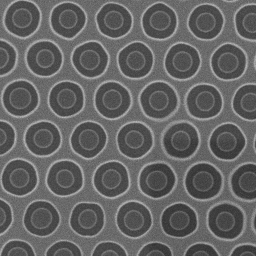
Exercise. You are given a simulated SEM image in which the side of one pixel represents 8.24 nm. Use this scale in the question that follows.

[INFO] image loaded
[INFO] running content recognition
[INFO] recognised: an array of small figures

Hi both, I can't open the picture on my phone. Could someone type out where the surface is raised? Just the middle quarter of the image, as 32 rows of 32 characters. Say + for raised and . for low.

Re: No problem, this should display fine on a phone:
+++..+++...+++..++++..+++...++++
+++.......++++........+++...+++.
++++.....++++++......+++++......
++++++.++++++++++..+++++++++....
..+++++++++..++++++++++..+++++++
....+++++......++++++......+++++
++...+++........++++........++++
+++..+++..++++...++...+++...+++.
+++..+++..++++...++..+++++..++..
+++..+++..++++...++..+++++...+..
++...+++..++++..+++...++++..+++.
....++++........++++........+++.
...++++++......+++++.......++++.
+++++++++++..+++++++++....++++++
+++++..+++++++++++.++++++++++..+
+++......++++++......+++++......
++........++++.......++++.......
++..++++...+++..+++...+++...+++.
++..++++...++..+++++..++...++++.
+...++++...++...++++..++...++++.
++..++++..++++..+++...+++..++++.
++........++++.......++++....+..
++++.....++++++.....++++++......
+++++..++++++++++.++++++++++...+
..+++++++++..++++++++++..+++++++
....+++++......+++++......++++++
....++++........+++........++++.
++...+++..++++..+++..++++...+++.
++...++...++++..+++..+++++..++..
++...++...++++..+++..+++++..++..
++...+++..+++...+++..++++...++..
....++++........+++........+++..